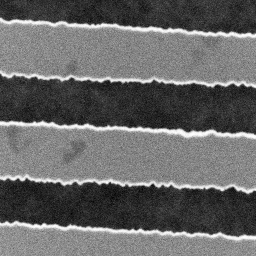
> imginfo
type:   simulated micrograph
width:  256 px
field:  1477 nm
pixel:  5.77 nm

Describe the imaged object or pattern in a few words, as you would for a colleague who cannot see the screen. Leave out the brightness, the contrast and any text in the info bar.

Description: lines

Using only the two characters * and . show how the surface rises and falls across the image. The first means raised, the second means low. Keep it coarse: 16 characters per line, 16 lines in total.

................
*****...........
****************
****************
****************
................
................
................
****************
****************
****************
.......*********
................
................
***********.....
****************